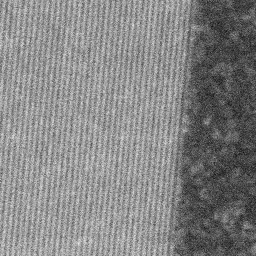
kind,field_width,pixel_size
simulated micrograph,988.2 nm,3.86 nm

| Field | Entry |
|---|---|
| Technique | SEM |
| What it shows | parallel lines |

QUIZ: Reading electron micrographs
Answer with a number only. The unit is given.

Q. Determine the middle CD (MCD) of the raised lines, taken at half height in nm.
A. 10.1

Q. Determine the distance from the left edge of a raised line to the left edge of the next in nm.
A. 20.9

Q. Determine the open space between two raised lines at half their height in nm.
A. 12